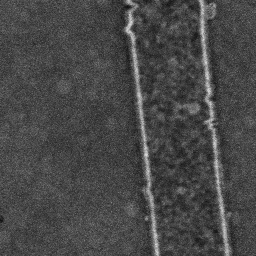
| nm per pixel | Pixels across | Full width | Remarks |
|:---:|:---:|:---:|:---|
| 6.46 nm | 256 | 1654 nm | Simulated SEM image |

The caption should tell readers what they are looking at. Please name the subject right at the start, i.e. one or a few lines or trenches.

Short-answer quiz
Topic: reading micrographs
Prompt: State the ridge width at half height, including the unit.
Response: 451 nm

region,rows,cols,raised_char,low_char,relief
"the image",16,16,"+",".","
........+++++...
........+++++...
........+++++...
........+++++...
.........++++...
.........++++...
.........++++...
.........++++...
.........++++...
.........++++...
.........+++++..
.........+++++..
.........+++++..
..........++++..
..........++++..
..........++++..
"